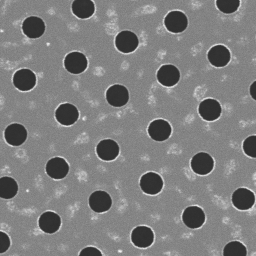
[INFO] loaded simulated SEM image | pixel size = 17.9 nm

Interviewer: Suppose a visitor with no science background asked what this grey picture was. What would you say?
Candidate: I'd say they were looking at a regular array of holes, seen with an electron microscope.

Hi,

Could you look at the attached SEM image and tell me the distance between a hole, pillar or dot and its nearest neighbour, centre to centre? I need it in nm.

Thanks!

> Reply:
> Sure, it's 956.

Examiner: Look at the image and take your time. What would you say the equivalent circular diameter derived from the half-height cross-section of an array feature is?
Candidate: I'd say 0.411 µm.